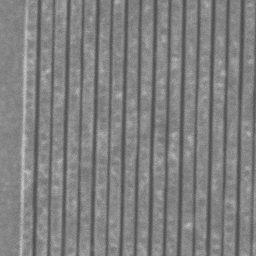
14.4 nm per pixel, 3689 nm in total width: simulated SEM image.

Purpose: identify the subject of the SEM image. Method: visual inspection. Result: parallel lines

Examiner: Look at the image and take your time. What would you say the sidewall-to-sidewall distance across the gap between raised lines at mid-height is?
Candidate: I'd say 55.8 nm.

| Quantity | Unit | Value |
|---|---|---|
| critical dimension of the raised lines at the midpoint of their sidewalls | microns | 0.153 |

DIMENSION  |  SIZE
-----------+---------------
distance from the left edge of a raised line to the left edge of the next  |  0.21 um